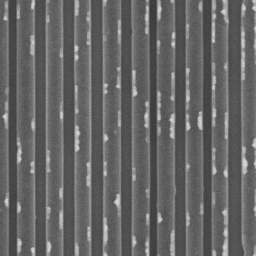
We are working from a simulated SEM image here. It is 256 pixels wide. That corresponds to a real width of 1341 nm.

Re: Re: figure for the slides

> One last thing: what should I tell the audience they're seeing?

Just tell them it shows parallel lines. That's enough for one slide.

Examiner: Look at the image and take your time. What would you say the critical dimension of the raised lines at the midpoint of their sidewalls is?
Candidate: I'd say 89.8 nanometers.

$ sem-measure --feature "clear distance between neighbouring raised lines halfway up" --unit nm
57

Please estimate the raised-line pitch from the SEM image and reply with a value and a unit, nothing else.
0.145 um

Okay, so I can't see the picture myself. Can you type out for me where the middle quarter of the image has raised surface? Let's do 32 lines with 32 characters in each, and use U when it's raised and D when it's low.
DDDUUUDDDDUUUUDDDUUUUDDUUUUUDDDU
DDDUUUDDDDUUUUDDDUUUUDDUUUUUDDDU
DDDUUUDDDDUUUUDDDUUUUDDUUUUUDDDU
DDDUUUDDDDUUUUDDDUUUUDDUUUUUDDDU
DDDUUUDDDDUUUUDDDUUUUDDUUUUUDDDU
DDDUUUDDDDUUUUDDDUUUUDDUUUUUDDDU
DDDUUUDDDDUUUUDDDUUUUDDUUUUDDDDU
DDDUUUDDDDUUUUDDDUUUUDDUUUUDDDDU
DDDUUUDDDDUUUUDDDUUUUDDUUUUDDDDU
DDDUUUDDDDUUUUDDDUUUUDDUUUUUDDDU
DDDUUUDDDDUUUUDDDUUUUDDUUUUUDDDU
DDDUUUDDDDUUUUDDDUUUUDDUUUUUDDDU
DDDUUUDDDDUUUUDDDUUUUDDUUUUUDDDU
DDDUUUUDDDUUUUDDDUUUUDDUUUUUDDDU
DDDUUUUDDDUUUUDDDUUUUDDUUUUUDDDU
DDDUUUUDDDUUUUDDDUUUUDDUUUUUDDDU
DDDUUUUDDDUUUUDDDUUUUDDUUUUUDDDU
DDDUUUUDDDUUUUDDDUUUUDDUUUUDDDDU
DDDUUUUDDDUUUUDDDUUUUDDUUUUDDDDU
DDDUUUUDDDUUUUDDDUUUUDDUUUUDDDDU
DDDUUUUDDDUUUUDDDUUUUDDUUUUDDDDU
DDDUUUUDDDUUUUDDDUUUUDDUUUUDDDDU
DDDUUUUDDDUUUUDDDUUUUDDUUUUDDDDU
DDDUUUDDDDUUUUDDDUUUUDDUUUUDDDDU
DDDUUUDDDDUUUUDDDUUUUDDUUUUDDDDU
DDDUUUDDDDUUUUDDDUUUUDDUUUUDDDDU
DDDUUUDDDDUUUUDDDUUUUDDUUUUDDDDU
DDDUUUDDDDUUUUDDDUUUUDDUUUUDDDDU
DDDUUUDDDDUUUUDDDUUUUDDUUUUDDDDU
DDDUUUDDDDUUUUDDDUUUUDDUUUUDDDDU
DDDUUUDDDDUUUUDDDUUUUDDUUUUUDDDU
DDDUUUDDDDUUUUDDDUUUUDDUUUUUDDDU